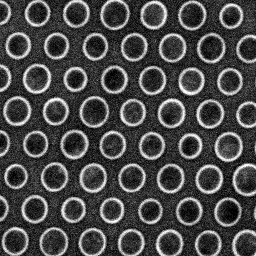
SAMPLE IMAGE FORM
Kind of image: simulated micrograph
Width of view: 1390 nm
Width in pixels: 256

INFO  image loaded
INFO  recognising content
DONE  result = a regular array of raised bodies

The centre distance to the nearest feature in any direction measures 0.205 micrometres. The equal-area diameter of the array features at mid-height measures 0.142 microns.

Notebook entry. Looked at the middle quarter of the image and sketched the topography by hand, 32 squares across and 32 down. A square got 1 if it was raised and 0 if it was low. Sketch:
00000000000000000000000000000000
01111000000111100000111100000011
01111000001111100001111110000111
11111100001111110001111110000111
11111100001111110001111110000111
01111000001111100001111110000111
00110000001111100000111100000111
00000000000000000000011000000000
00000011100000000000000000000000
00000111110000001110000001111000
10001111111000011111000011111100
10001111111000111111000011111100
10001111111000111111000011111100
10001111111000111111000011111100
00000111110000011110000011111000
00000011100000000000000001110000
00000000000000000000000000000000
11111000000111000000011000000000
11111100001111100000111100000011
11111100011111100001111110000111
11111100011111100001111110000111
11111100011111100001111110000111
11111000001111000001111100000111
00110000000010000000011000000000
00000000000000000000000000000000
00000011100000001110000001110000
00000111110000111111000011111000
10001111110000111111000011111100
10001111110000111111000111111100
10001111110000111111000111111100
00001111110000111111000011111000
00000011100000011100000001111000